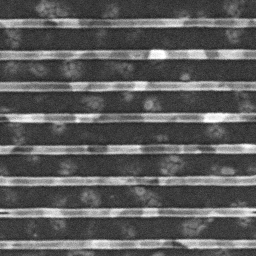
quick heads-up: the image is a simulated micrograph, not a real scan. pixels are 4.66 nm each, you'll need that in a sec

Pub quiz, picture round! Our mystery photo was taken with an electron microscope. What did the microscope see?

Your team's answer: parallel lines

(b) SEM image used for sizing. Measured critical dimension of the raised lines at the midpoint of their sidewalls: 36.1 nm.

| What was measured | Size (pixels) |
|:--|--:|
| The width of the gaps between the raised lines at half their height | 24.2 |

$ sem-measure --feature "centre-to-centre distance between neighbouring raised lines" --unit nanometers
147